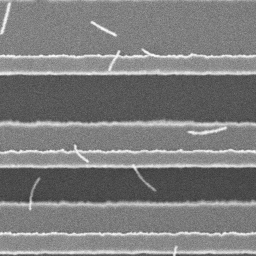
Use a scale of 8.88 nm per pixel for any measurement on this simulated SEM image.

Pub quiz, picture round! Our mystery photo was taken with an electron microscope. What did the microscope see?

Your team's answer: lines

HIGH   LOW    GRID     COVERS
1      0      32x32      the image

11111111111111111111111111111111
11111111111111111111111111111111
11111111111111111111111111111111
11111111111111111111111111111111
11111111111111111111111111111111
11111111111111111111111111111111
11111111111111111111111111111111
11111111111111111111111111111111
11111111111111111111111111111111
00000000000000000000000000000000
00000000000000000000000000000000
00000000000000000000000000000000
00000000000000000000000000000000
00000000000000000000000000000000
00000000000000000000000000000000
01000000000000100000000100000000
11111111111111111111111111111111
11111111111111111111111111111111
11111111111111111111111111111111
11111111111111111111111111111111
11111111111111111111111111111111
00000000000000000000000000000000
00000000000000000000000000000000
00000000000000000000000000000000
00000000000000000000000000000000
10010001100000000000000001111101
11111111111111111111111111111111
11111111111111111111111111111111
11111111111111111111111111111111
11111111111111111111111111111111
11111111111111111111111111111111
11111111111111111111111111111111